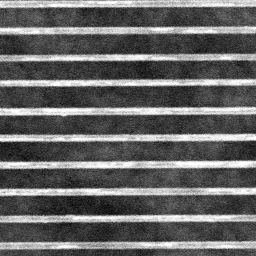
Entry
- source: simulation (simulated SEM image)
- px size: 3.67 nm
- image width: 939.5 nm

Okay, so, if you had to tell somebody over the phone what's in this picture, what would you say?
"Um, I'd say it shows parallel lines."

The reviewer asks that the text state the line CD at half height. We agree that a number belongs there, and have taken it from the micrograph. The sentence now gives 5.5 pixels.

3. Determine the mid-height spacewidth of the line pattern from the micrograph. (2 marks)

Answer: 0.0766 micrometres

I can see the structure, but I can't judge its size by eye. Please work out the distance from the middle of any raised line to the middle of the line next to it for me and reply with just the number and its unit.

98.7 nanometres